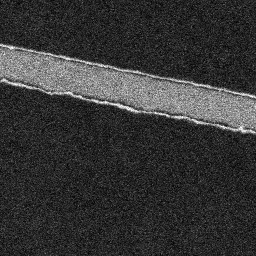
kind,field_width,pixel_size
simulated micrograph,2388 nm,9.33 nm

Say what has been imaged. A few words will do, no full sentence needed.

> one or a few lines or trenches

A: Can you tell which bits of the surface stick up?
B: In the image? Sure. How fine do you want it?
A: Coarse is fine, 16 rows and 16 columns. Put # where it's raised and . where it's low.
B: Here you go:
################
################
################
...#############
........########
##...........###
#######.........
############....
################
################
################
################
################
################
################
################